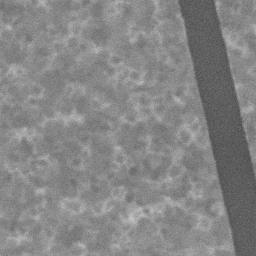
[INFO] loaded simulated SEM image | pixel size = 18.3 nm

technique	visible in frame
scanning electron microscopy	one or a few lines or trenches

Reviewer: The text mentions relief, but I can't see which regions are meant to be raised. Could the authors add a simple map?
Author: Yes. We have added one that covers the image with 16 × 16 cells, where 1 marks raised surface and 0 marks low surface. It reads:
1111111111100011
1111111111100011
1111111111110011
1111111111110011
1111111111110011
1111111111110001
1111111111111001
1111111111111001
1111111111111001
1111111111111000
1111111111111100
1111111111111100
1111111111111100
1111111111111100
1111111111111100
1111111111111110